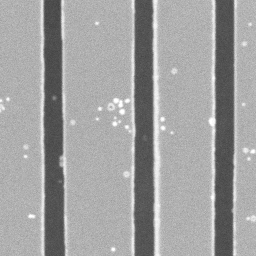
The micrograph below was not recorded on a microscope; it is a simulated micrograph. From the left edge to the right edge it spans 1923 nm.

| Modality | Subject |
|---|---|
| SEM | lines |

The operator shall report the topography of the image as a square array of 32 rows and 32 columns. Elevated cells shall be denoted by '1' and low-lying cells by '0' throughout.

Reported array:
11111000111111111001111111100111
11111000111111111001111111100111
11111000111111111001111111100111
11111000111111111001111111100111
11111000111111111001111111100111
11111000111111111001111111100111
11111000111111111001111111100111
11111000111111111001111111100111
11111000111111111001111111100111
11111000111111111001111111100111
11111000111111111001111111100111
11111000111111111001111111100111
11111000111111111001111111100111
11111000111111111001111111100111
11111000111111111001111111100111
11111000111111111001111111100111
11111000111111111001111111100111
11111000111111111001111111100111
11111000111111111001111111100111
11111000111111111001111111100111
11111000111111111001111111100111
11111000111111111001111111100111
11111000111111111001111111100111
11111000111111111001111111100111
11111000111111111001111111100111
11111000111111111001111111100111
11111000111111111001111111100111
11111000111111111001111111100111
11111000111111111001111111100111
11111000111111111001111111100111
11111000111111111001111111100111
11111000111111111001111111100111